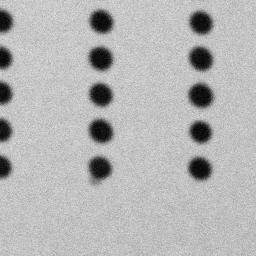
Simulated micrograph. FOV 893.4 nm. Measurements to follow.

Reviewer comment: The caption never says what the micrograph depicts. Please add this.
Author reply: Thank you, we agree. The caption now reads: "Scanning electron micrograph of a regular array of holes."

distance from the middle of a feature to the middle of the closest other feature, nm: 127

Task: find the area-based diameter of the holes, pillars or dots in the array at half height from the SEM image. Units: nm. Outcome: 86.7